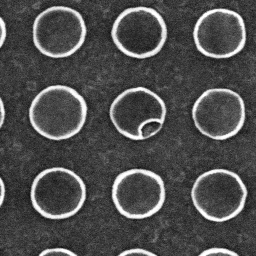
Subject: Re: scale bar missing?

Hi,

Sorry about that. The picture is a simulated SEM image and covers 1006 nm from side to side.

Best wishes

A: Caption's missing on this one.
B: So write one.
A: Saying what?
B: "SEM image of a regular array of raised bodies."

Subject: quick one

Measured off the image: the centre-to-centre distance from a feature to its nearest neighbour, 314 nm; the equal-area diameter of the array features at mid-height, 199 nm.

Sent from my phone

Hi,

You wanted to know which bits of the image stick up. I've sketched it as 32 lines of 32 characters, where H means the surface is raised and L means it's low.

LLLLLLLLLLLLLLLLLLLLLLLLLLLLLLLL
LLLLLHHHHLLLLLLLHHHLLLLLLLHHHLLL
LLLLLHHHHHLLLLLHHHHHLLLLLHHHHHLL
HLLLHHHHHHHLLLHHHHHHHLLLHHHHHHHL
HLLLHHHHHHLLLLHHHHHHHLLLHHHHHHHL
LLLLLHHHHHLLLLLHHHHHLLLLLHHHHHLL
LLLLLHHHHLLLLLLLHHHLLLLLLHHHHHLL
LLLLLLLLLLLLLLLLLLLLLLLLLLLLLLLL
LLLLLLLLLLLLLLLLLLLLLLLLLLLLLLLL
LLLLLLLLLLLLLLLLLLLLLLLLLLLLLLLL
LLLLLLLLLLLLLLLLLLLLLLLLLLLLLLLL
LLLLLHHHHLLLLLLLHHHLLLLLLLHHHLLL
LLLLHHHHHHLLLLLHHHHHLLLLLHHHHHLL
LLLLHHHHHHHLLLHHHHHHHLLLHHHHHHLL
LLLLHHHHHHHLLLHHHHHHLLLLHHHHHHLL
LLLLHHHHHHLLLLHHHHLLLLLLLHHHHHLL
LLLLLHHHHLLLLLLHHHLLLLLLLHHHHHLL
LLLLLLLLLLLLLLLLLLLLLLLLLLLLLLLL
LLLLLLLLLLLLLLLLLLLLLLLLLLLLLLLL
LLLLLLLLLLLLLLLLLLLLLLLLLLLLLLLL
LLLLLLLLLLLLLLLLLLLLLLLLLLLLLLLL
LLLLLLHHHLLLLLLLHHLLLLLLLLHHHLLL
LLLLHHHHHHLLLLLHHHHHLLLLLHHHHHLL
LLLLHHHHHHHLLLHHHHHHLLLLHHHHHHHL
LLLLHHHHHHHLLLHHHHHHLLLLHHHHHHHL
LLLLHHHHHHLLLLHHHHHHLLLLHHHHHHLL
LLLLLHHHHLLLLLLHHHHLLLLLLHHHHHLL
LLLLLLLLLLLLLLLLLLLLLLLLLLHHLLLL
LLLLLLLLLLLLLLLLLLLLLLLLLLLLLLLL
LLLLLLLLLLLLLLLLLLLLLLLLLLLLLLLL
LLLLLLLLLLLLLLLLLLLLLLLLLLLLLLLL
LLLLLLHHHLLLLLLLHHLLLLLLLLHHHLLL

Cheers